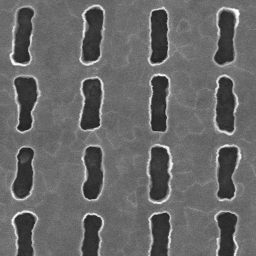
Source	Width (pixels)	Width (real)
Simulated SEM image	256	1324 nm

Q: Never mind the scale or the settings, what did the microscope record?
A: a regular array of holes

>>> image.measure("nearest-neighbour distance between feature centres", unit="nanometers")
342